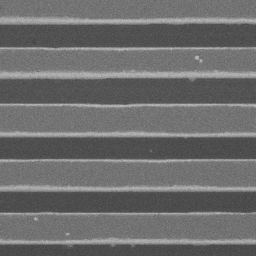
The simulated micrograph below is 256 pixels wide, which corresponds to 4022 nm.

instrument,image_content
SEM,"lines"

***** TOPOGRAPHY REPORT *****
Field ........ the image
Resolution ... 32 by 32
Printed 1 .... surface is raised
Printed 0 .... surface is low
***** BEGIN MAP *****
11111111111111111111111111111111
11111111111111111111111111111111
11111111111111111111111111111111
00000000000000000000000000000000
00000000000000000000000000000000
00000000000000000000000000000000
11111111111111111111111111111111
11111111111111111111111111111111
11111111111111111111111111111111
11111111111111111111111111111111
00000000000000000000000000000000
00000000000000000000000000000000
00000000000000000000000000000000
11111111111111111111111111111111
11111111111111111111111111111111
11111111111111111111111111111111
11111111111111111111111111111111
00000000000000000000000000000000
00000000000000000000000000000000
00000000000000000000000000000000
11111111111111111111111111111111
11111111111111111111111111111111
11111111111111111111111111111111
11111111111111111111111111111111
00000000000000000000000000000000
00000000000000000000000000000000
00000000000000000000000000000000
11111111111111111111111111111111
11111111111111111111111111111111
11111111111111111111111111111111
00000000000000000000000000000000
00000000000000000000000000000000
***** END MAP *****